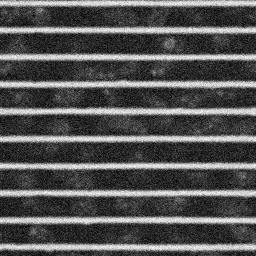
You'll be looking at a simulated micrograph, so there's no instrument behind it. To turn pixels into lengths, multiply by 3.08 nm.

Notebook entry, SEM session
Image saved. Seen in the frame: parallel lines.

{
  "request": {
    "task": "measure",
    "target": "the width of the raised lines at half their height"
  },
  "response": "4.74 px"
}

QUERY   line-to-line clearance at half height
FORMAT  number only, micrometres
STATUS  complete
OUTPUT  0.0677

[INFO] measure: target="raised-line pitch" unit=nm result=83.5